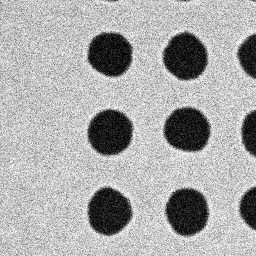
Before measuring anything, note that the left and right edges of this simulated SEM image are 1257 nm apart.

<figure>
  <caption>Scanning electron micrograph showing holes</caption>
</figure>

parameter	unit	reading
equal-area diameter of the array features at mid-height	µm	0.227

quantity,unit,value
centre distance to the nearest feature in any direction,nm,374